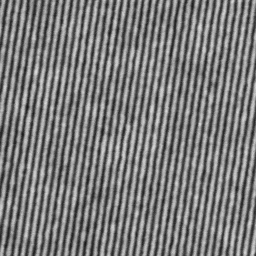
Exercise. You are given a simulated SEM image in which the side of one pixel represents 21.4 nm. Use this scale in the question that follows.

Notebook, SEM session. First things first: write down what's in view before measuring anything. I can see parallel lines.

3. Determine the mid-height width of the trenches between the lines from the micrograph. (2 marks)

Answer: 76.7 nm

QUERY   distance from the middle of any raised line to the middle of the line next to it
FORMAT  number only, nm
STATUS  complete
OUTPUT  152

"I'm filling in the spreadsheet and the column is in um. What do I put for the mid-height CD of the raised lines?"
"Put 0.0767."